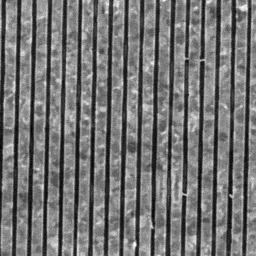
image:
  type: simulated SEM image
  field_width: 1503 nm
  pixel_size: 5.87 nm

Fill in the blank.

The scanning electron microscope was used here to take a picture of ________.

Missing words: parallel lines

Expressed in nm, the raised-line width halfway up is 58.7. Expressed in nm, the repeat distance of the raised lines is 90.1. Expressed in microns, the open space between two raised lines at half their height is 0.0293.